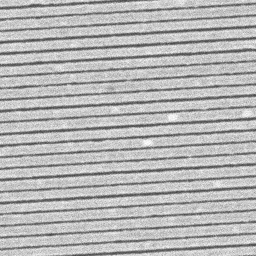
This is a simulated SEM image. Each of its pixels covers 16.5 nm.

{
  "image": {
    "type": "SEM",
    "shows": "parallel lines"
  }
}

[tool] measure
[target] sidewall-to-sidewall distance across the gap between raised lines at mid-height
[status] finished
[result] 45.4 nm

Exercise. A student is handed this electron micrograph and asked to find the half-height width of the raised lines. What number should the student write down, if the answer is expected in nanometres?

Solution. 134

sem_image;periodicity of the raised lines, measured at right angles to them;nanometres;189